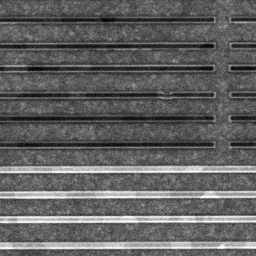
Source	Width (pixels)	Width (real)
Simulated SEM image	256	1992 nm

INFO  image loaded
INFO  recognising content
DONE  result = parallel lines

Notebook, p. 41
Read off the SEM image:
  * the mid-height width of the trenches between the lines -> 152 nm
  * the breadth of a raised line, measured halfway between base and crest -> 44.7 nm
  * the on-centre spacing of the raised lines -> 25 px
